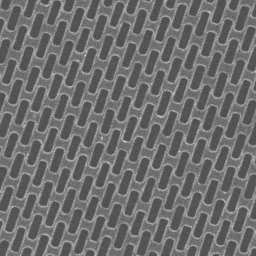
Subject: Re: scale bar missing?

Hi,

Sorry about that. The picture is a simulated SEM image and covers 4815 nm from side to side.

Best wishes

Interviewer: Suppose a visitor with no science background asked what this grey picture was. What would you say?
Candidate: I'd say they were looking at a regular array of holes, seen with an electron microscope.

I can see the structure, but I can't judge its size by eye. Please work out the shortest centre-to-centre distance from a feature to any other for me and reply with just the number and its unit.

393 nm